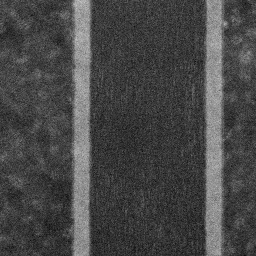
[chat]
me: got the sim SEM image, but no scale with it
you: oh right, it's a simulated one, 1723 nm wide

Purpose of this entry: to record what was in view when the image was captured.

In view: one or a few lines or trenches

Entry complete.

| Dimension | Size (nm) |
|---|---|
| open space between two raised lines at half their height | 899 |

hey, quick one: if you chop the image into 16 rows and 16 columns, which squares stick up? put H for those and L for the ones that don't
HHHHHLLLLLLLLHHH
HHHHHLLLLLLLLHHH
HHHHHLLLLLLLLHHH
HHHHHLLLLLLLLHHH
HHHHHLLLLLLLLHHH
HHHHHLLLLLLLLHHH
HHHHHLLLLLLLLHHH
HHHHHLLLLLLLLHHH
HHHHHLLLLLLLLHHH
HHHHHLLLLLLLLHHH
HHHHHLLLLLLLLHHH
HHHHHLLLLLLLLHHH
HHHHHLLLLLLLLHHH
HHHHHLLLLLLLLHHH
HHHHHLLLLLLLLHHH
HHHHHLLLLLLLLHHH